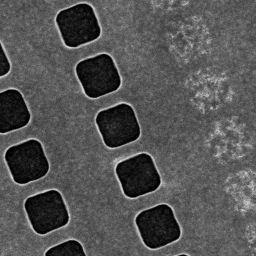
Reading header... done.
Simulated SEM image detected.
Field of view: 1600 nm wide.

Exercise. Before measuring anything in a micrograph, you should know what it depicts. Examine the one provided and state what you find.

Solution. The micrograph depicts holes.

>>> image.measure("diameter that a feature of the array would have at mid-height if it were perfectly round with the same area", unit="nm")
268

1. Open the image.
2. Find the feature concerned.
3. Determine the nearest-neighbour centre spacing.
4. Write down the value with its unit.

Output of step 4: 54.1 pixels